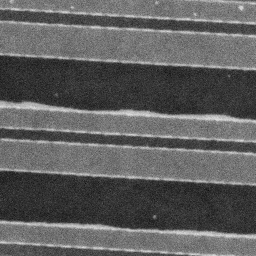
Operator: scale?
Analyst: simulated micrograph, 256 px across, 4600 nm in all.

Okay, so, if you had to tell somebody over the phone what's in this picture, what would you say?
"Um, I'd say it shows lines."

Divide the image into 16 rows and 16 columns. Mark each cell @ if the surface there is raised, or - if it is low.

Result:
@@@@@@@@@@@@@@@@
@@@@@@@@@@@@@@@@
@@@@@@@@@@@@@@@@
--@@@@@@@@@@@@@@
----------------
----------------
----------------
@@@@@@@@@@@@@@@-
@@@@@@@@@@@@@@@@
@@@@@@@@@@@@@@@@
@@@@@@@@@@@@@@@@
---------------@
----------------
----------------
@@@@@@@@@@@-----
@@@@@@@@@@@@@@@@